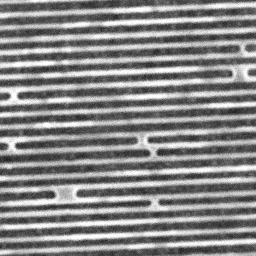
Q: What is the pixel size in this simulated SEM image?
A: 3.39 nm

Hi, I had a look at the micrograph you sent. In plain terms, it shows parallel lines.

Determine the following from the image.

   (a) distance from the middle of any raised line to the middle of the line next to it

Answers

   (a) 42.2 nanometres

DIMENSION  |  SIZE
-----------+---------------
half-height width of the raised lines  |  13.5 nm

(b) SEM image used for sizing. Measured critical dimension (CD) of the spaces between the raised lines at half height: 8.73 px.